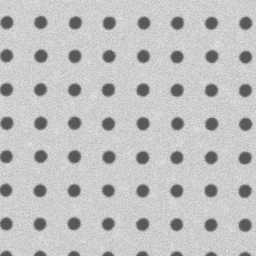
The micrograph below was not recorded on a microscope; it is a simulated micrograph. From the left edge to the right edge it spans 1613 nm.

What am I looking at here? a regular array of holes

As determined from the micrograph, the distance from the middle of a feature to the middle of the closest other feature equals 210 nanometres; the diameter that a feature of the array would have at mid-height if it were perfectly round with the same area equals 80.4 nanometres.